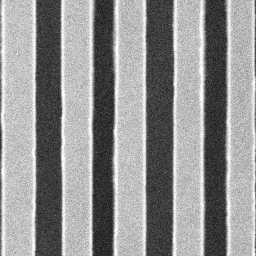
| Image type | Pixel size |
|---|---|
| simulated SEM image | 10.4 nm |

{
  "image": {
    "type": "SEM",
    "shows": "lines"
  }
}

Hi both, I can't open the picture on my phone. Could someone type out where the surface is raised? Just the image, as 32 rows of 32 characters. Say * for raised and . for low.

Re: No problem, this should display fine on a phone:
****....***....***....***....***
****....***....***....***....***
****....***....***....***....***
****....***....***....***....***
****....***....***....***....***
****....***....***....***....***
****....***....***....***....***
****....***....***....***....***
****....***....***....***....***
****....***....***....***....***
****....***....***....***....***
****....***....***....***....***
****....***....***....***....***
****....***....***....***....***
****....***....***....***....***
****....***...****....***....***
****....***...****....***....***
****....***...****....***....***
****....***...****....***....***
****....***...****....***....***
****....***...****....***....***
****....***...****....***....***
****....***...****....***....***
****....***...****....***....***
****....***....***....***....***
****....***...****....***....***
****....***...****....***....***
****....***...****....***....***
****....***...****....***....***
****....***...****....***....***
****....***...****....***....***
****....***...****....***....***